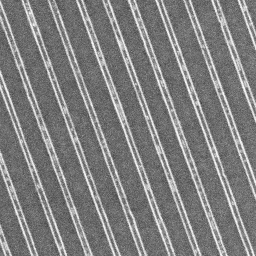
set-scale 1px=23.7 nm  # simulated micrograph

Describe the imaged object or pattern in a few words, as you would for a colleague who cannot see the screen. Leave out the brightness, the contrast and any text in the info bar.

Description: parallel lines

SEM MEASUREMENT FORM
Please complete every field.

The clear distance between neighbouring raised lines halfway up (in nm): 485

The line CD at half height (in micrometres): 0.126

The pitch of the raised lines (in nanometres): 604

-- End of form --